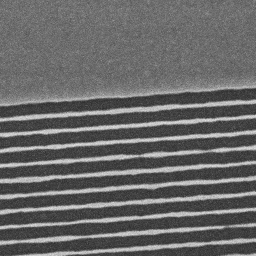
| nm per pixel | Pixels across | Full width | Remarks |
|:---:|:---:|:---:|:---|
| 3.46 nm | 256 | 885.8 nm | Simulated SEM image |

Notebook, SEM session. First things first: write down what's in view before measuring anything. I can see parallel lines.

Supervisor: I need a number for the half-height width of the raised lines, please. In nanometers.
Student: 12.5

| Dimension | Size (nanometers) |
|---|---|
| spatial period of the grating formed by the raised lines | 53.2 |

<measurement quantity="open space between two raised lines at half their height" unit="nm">40.5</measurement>